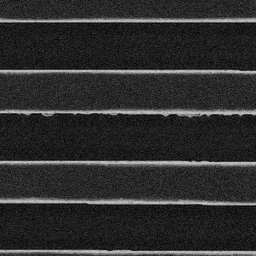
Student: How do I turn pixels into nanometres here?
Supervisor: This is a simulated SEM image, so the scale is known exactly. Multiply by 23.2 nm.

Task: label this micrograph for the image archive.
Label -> lines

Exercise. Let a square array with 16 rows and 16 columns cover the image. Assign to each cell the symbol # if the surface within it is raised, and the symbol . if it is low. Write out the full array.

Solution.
################
................
................
................
################
################
################
................
................
................
################
################
################
................
................
................